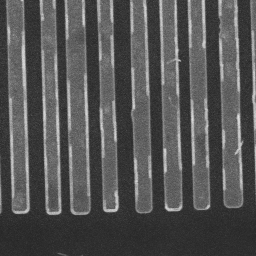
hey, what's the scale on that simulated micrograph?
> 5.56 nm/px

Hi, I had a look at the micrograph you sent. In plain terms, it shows parallel lines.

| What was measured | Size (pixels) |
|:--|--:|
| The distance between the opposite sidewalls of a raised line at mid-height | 17.1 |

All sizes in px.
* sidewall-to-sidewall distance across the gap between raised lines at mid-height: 12.9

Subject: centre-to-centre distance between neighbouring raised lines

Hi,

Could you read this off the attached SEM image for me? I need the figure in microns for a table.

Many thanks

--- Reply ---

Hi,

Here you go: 0.169